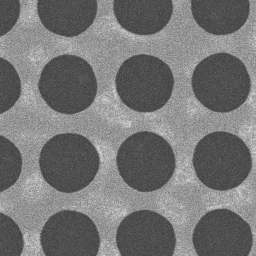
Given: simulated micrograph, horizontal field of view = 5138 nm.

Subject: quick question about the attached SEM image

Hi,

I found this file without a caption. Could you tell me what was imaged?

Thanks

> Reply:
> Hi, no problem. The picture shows holes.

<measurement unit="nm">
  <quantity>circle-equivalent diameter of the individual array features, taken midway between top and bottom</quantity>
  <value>1200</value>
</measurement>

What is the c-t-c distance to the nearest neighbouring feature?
1530 nanometres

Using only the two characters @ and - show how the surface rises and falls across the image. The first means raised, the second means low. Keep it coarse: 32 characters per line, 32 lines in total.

--@@@-------@@--------@@-------@
--@@@-------@@--------@@-------@
--@@@-------@@@------@@@-------@
--@@@@-----@@@@-----@@@@@-----@@
@@@@@@@@-@@@@@@@@@@@@@@@@@@@@@@@
@@@@@@@@@@@@@@@@@@@@@@@@@@@@@@@@
@@@@@@@@@@@@@@@@@@@@@@@@@@@@@@@@
-@@@@@-----@@@@@----@@@@@-----@@
--@@@-------@@@------@@@-------@
--@@@-------@@--------@@-------@
---@@-------@@--------@@-------@
---@@-------@@@-------@@-------@
--@@@-------@@@------@@@@------@
-@@@@@-----@@@@@----@@@@@@----@@
@@@@@@@@@@@@@@@@@@@@@@@@@@@@@@@@
@@@@@@@@@@@@@@@@@@@@@@@@@@@@@@@@
@@@@@@@@@@@@@@@@@--@@@@@@@@-@@@@
-@@@@@-----@@@@@-----@@@@-----@@
--@@@-------@@@-------@@-------@
---@@-------@@@-------@@-------@
---@@-------@@@-------@@--------
---@@-------@@@-------@@-------@
--@@@@------@@@------@@@@------@
-@@@@@@----@@@@@----@@@@@@---@@@
@@@@@@@@@@@@@@@@@@@@@@@@@@@@@@@@
@@@@@@@@@@@@@@@@@@@@@@@@@@@@@@@@
@@@@@@@---@@@@@@@--@@@@@@@---@@@
--@@@@------@@@------@@@@------@
--@@@-------@@@-------@@-------@
---@@-------@@--------@@--------
---@@--------@@-------@@--------
---@@-------@@@-------@@-------@